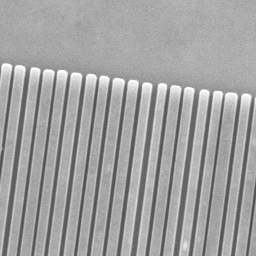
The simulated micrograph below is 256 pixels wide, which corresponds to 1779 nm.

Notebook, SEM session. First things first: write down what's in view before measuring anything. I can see parallel lines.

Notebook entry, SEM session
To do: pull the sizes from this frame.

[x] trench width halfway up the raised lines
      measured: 27.5 nm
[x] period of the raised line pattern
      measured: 98.6 nanometers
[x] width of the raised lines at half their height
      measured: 0.0672 um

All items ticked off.